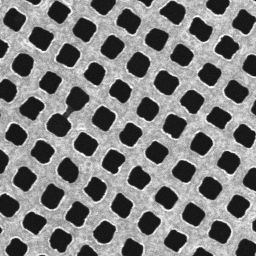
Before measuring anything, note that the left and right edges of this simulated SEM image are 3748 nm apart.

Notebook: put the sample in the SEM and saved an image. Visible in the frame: a regular array of holes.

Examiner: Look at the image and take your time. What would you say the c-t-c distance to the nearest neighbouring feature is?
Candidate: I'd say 457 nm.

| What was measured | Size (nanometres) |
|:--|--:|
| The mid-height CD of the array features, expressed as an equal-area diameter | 326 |